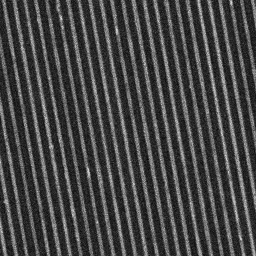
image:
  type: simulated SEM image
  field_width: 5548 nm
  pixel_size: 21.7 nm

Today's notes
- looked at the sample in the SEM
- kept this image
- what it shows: parallel lines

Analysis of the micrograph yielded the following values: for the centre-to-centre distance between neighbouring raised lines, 0.231 microns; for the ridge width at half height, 2.95 pixels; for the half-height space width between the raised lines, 171 nanometers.